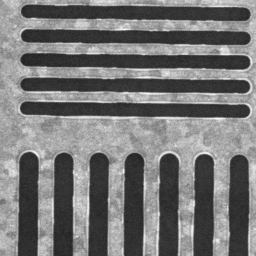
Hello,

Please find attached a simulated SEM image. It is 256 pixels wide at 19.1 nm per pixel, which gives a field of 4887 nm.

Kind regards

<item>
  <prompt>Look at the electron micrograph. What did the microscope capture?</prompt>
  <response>groups of lines, slits or small figures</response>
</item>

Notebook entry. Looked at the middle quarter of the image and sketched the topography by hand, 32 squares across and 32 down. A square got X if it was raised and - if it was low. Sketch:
--------------------------------
XXXXXXXXXXXXXXXXXX---XXXXXXXXXXX
XXXXXXXXXXXXXXXXXXXXXXXXXXXXXXXX
---------------------------XXXXX
--------------------------------
--------------------------------
--------------------------------
XXXXXXXXXXXXXXXXXXXXX-----XXXXXX
XXXXXXXXXXXXXXXXXXXXXXXXXXXXXXXX
--------------------------XXXXXX
--------------------------------
--------------------------------
--------------------------------
X---XXXXX---------XX------------
XXXXXXXXXXXXXXXXXXXXXXXXXXXXXXXX
XXXXXXXXXXXXXXXXXXXXXXXXXXXXXXXX
XXXXXXXXXXXXXXXXXXXXXXXXXXXXXXXX
XXXXXXXXXXXXXXXXXXXXXXXXXXXXXXXX
XXXXXXXXXXXXXXXXXXXXXXXXXXXXXXXX
XXXXXXXXXXXXXXXXXXXXXXXXXXXXXXXX
XXXXXXXXXXXXXXXXXXXXXXXXXXXXXXXX
XXXXXXXXXXXXXXXXXXXXXXXXXXXXXXXX
-XXXXXX---XXXXXX---XXXXXX---XXXX
--XXXX-----XXXX-----XXXX-----XXX
---XXX------XXX-----XXXX-----XXX
---XXX------XXX-----XXXX-----XXX
---XXX------XXX-----XXXX-----XXX
---XXX------XXX-----XXXX-----XXX
---XXX-----XXXX-----XXXX-----XXX
---XXX-----XXXX-----XXXX-----XXX
---XXX-----XXXX-----XXXX-----XXX
---XXX-----XXXX-----XXX------XXX